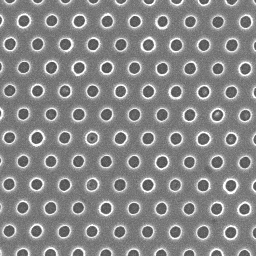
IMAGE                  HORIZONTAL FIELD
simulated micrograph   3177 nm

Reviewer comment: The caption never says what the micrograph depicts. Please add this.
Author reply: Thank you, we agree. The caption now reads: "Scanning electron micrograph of a regular array of holes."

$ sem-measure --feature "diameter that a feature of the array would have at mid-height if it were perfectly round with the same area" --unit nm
147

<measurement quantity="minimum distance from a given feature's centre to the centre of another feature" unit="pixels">26.9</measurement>